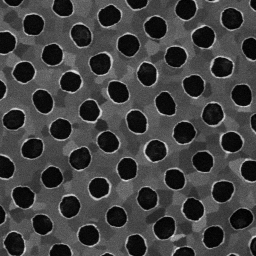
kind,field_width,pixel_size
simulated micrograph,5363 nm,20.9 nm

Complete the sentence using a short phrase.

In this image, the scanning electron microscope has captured a regular array of holes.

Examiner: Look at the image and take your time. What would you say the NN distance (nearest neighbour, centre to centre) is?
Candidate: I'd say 701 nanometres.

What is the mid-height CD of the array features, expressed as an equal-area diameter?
452 nm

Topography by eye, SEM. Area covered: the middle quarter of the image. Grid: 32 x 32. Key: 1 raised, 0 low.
11111100000011111110001111100111
11111110000111111100000111111111
00001111001111111100000111111111
00001111111111111100000111111100
00001111111100111110000111111100
00001111111000011111001111111100
00011111111000001111111111111100
11111111111000001111111100111110
11111111111100001111111000011111
11111000111110011111111000001111
11110000011111111111111000001111
11110000011111111011111000001111
11110000011111110000111100001111
11110000111111110000011111111111
01111110111111110000011111111001
00111111111111110000011111110000
00111111111111111000111111100000
00111111100001111111111111100000
01111111000001111111111111110000
11111111000000111111100001110000
11111111100000111111000000111111
11100011110001111111000000111111
11000001111111111111000000111111
10000001111111100111100001111111
10000001111111000011110111111111
11000011111110000011111111111111
11101111111110000011111111000111
11111111111111000011111110000011
11111111001111000111111110000011
11111110000111111111111110000011
11111100000011111111111111000011
11111100000111111110001111111111